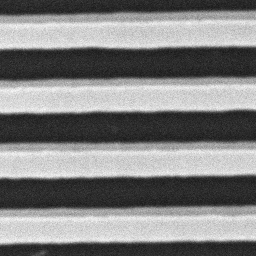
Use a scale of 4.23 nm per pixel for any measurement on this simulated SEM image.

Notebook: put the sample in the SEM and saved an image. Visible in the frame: lines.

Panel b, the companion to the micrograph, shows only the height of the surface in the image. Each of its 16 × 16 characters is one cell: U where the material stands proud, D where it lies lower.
DDDDDDDDDDDDDDDD
UUUUUUUUUUUUUUUU
UUUUUUUUUUUUUUUU
DDDDDDDDDDDDDDDD
DDDDDDDDDDDDDDDD
UUUUUUUUUUUUUUUU
UUUUUUUUUUUUUUUU
DDDDDDDDDDDDDDDD
DDDDDDDDDDDDDDDD
UUUUUUUUUUUUUUUU
UUUUUUUUUUUUUUUU
DDDDDDDDDDDDDDDD
DDDDDDDDDDDDDDDD
UUUUUUUUUUUUUUUU
UUUUUUUUUUUUUUUU
DDDDDDDDDDDDDDDD